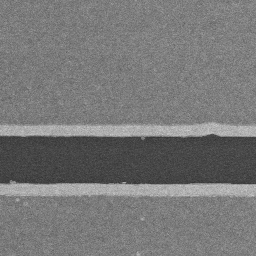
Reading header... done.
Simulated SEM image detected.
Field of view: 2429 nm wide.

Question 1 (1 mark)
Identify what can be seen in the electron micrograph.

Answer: one or a few lines or trenches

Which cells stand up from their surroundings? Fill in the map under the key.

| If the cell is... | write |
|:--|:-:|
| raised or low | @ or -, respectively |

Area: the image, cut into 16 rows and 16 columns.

@@@@@@@@@@@@@@@@
@@@@@@@@@@@@@@@@
@@@@@@@@@@@@@@@@
@@@@@@@@@@@@@@@@
@@@@@@@@@@@@@@@@
@@@@@@@@@@@@@@@@
@@@@@@@@@@@@@@@@
@@@@@@@@@@@@@@@@
----------------
----------------
----------------
----------------
@@@@@@@@@@@@@@@@
@@@@@@@@@@@@@@@@
@@@@@@@@@@@@@@@@
@@@@@@@@@@@@@@@@